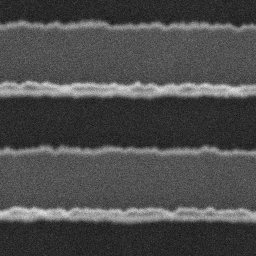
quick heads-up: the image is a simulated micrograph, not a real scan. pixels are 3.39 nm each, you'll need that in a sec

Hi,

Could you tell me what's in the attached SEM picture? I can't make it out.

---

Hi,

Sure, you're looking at lines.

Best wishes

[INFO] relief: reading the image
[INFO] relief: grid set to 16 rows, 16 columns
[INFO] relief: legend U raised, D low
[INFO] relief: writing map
DDDDDDDDDDDDDDDD
DUDDDDDDDDDDDDDD
UUUUUUUUUUUUUUUU
UUUUUUUUUUUUUUUU
UUUUUUUUUUUUUUUU
UUUUUUUUUUUUUUUU
DDDDDDDDDDDDDDDD
DDDDDDDDDDDDDDDD
DDDDDDDDDDDDDDDD
UUUUUUUUUUUUUUUU
UUUUUUUUUUUUUUUU
UUUUUUUUUUUUUUUU
UUUUUUUUUUUUUUUU
UUUUUUUUUUUUUUUU
DDDDDDDDDDDDDDDD
DDDDDDDDDDDDDDDD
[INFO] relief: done